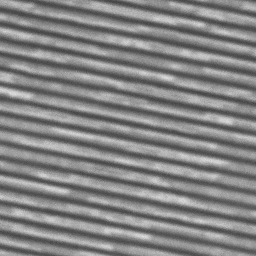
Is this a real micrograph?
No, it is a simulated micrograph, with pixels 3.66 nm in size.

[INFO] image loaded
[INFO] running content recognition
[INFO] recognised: parallel lines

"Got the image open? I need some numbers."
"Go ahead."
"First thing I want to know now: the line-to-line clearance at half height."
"24.8 nanometres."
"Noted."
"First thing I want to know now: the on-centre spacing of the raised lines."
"53.3 nm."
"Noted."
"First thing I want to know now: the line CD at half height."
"27.9 nm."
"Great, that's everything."